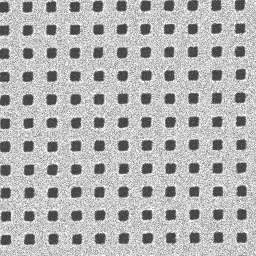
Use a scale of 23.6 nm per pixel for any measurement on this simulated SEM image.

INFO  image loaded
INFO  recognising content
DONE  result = a regular array of holes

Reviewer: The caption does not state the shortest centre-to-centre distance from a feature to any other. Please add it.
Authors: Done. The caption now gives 545 nm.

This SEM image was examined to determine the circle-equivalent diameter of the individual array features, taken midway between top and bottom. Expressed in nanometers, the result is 284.